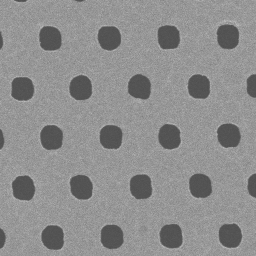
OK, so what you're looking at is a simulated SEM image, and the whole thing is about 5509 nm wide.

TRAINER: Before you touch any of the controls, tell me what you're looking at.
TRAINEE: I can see a regular array of holes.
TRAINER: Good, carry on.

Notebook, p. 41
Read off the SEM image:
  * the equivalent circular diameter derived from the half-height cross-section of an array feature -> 525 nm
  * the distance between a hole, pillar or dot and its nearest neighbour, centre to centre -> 1240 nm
